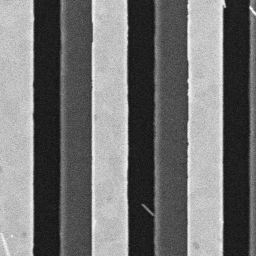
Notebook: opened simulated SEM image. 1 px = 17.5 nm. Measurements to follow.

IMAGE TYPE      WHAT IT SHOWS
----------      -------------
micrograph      lines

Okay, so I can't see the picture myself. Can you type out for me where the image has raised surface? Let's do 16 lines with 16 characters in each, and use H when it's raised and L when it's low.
HHLLHHHHLLHHHHLL
HHLLHHHHLLHHHHLL
HHLLHHHHLLHHHHLL
HHLLHHHHLLHHHHLL
HHLLHHHHLLHHHHLL
HHLLHHHHLLHHHHLL
HHLLHHHHLLHHHHLL
HHLLHHHHLLHHHHLL
HHLLHHHHLLHHHHLL
HHLLHHHHLLHHHHLL
HHLLHHHHLLHHHHLL
HHLLHHHHLLHHHHLL
HHLLHHHHLLHHHHLL
HHLLHHHHLLHHHHLL
HHLLHHHHLLHHHHLL
HHLLHHHHLLHHHHLL